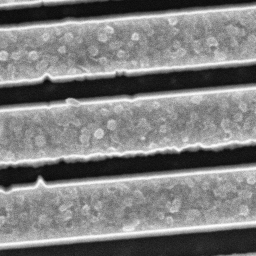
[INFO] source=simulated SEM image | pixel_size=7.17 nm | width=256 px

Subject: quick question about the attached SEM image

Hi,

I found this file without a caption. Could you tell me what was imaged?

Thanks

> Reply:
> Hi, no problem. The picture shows one or a few lines or trenches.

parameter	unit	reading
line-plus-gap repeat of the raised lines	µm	0.577